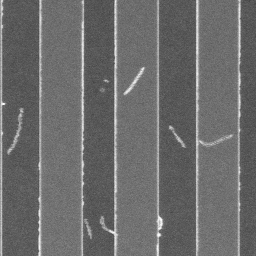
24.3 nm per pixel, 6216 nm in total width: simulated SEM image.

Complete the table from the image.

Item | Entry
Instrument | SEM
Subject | lines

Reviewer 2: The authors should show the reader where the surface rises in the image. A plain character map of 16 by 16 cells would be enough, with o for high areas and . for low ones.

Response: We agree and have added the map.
...oo..ooo..ooo.
...oo..ooo..ooo.
...oo..ooo..ooo.
...oo..ooo..ooo.
...oo..ooo..ooo.
...oo..ooo..ooo.
...oo..ooo..ooo.
...oo..ooo..ooo.
...oo..ooo..ooo.
...oo..ooo..ooo.
..ooo..ooo..ooo.
...oo..ooo..ooo.
..ooo..ooo..ooo.
..ooo..ooo..ooo.
..ooo..ooo..ooo.
..ooo..ooo..ooo.